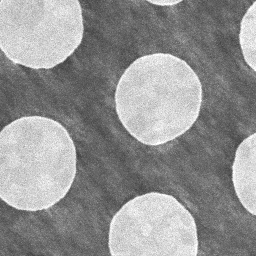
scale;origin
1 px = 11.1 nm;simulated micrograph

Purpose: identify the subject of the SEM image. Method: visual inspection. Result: raised bodies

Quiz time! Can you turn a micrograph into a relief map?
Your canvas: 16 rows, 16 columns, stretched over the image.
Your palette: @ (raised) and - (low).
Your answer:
@@@@@-----------
@@@@@----------@
@@@@@----------@
-@@@-----@@----@
--------@@@@----
-------@@@@@@---
-------@@@@@@---
-@@-----@@@@----
@@@@----@@@-----
@@@@@----------@
@@@@@----------@
@@@@-----------@
@@@@----@@@----@
-------@@@@@----
-------@@@@@----
-------@@@@@----